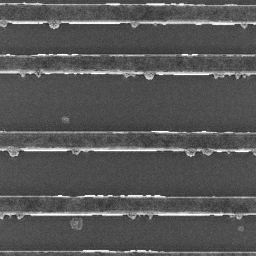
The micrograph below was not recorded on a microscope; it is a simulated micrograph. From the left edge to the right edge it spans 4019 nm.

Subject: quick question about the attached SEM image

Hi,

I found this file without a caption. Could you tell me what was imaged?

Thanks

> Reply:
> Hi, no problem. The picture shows lines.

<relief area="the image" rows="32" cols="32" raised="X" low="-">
--------------------------------
XXXXXXXXXXXXXXXXXXXXXXXXXXXXXXXX
XXXXXXXXXXXXXXXXXXXXXXXXXXXXXXXX
--------------------------------
--------------------------------
--------------------------------
--------------------------------
XXXXXXXXXXXXXXXXXXXXXXXXXXXXXXXX
XXXXXXXXXXXXXXXXXXXXXXXXXXXXXXXX
------------------X-------------
--------------------------------
--------------------------------
--------------------------------
--------------------------------
--------------------------------
--------------------------------
--------------------------------
XXXXXXXXXXXXXXXXXXXXXXXXXXXXXXXX
XXXXXXXXXXXXXXXXXXXXXXXXXXXXXXXX
--------------------------------
--------------------------------
--------------------------------
--------------------------------
--------------------------------
--------------------------------
XXXXXXXXXXXXXXXXXXXXXXXXXXXXXXXX
XXXXXXXXXXXXXXXXXXXXXXXXXXXXXXXX
--------------------------------
--------------------------------
--------------------------------
--------------------------------
XXXXXXXXXXXXXXXXXXXX------------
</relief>